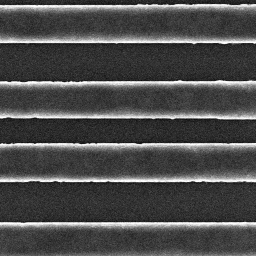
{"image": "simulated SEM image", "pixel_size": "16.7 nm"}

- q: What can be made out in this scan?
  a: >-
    lines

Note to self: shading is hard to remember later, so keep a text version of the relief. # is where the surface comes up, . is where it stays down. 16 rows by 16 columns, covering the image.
################
################
################
................
................
################
################
................
................
################
################
................
................
................
################
################